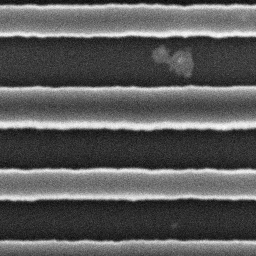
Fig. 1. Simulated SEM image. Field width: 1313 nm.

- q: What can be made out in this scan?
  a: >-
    lines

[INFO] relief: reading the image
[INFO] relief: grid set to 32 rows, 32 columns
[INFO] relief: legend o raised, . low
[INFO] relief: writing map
................................
oooooooooooooooooooooooooooooooo
oooooooooooooooooooooooooooooooo
oooooooooooooooooooooooooooooooo
....oo...ooo.o............oo....
................................
................................
................................
................................
................................
................................
oooooooooooooooooooooooooooooooo
oooooooooooooooooooooooooooooooo
oooooooooooooooooooooooooooooooo
oooooooooooooooooooooooooooooooo
oooooooooooooooooooooooooooooooo
................................
................................
................................
................................
................................
oooooooooooooooooooooooooooooooo
oooooooooooooooooooooooooooooooo
oooooooooooooooooooooooooooooooo
oooooooooooooooooooooooooooooooo
................................
................................
................................
................................
................................
oooooooooooooooooooooooooooooooo
oooooooooooooooooooooooooooooooo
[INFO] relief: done